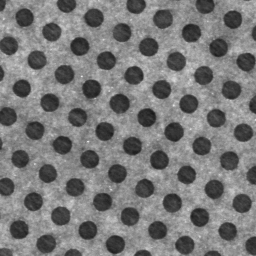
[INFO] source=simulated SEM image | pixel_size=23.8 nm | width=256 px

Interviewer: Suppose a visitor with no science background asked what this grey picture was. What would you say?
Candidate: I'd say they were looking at a regular array of holes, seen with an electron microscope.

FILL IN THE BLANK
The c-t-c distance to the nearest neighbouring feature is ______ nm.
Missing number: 733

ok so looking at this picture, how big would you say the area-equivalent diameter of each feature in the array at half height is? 19.3 pixels